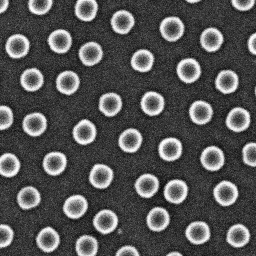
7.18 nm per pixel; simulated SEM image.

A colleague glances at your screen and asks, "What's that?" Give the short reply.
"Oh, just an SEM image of a regular array of raised bodies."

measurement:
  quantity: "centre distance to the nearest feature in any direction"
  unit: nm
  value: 274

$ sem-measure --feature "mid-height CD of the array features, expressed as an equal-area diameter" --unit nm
156